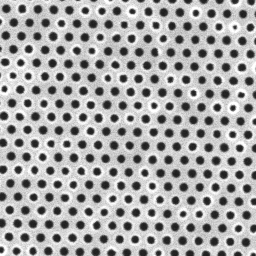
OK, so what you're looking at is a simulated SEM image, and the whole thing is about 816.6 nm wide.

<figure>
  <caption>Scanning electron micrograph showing a regular array of holes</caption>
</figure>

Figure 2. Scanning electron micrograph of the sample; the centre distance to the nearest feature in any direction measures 0.0485 microns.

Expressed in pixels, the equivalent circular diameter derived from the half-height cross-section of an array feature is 8.75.